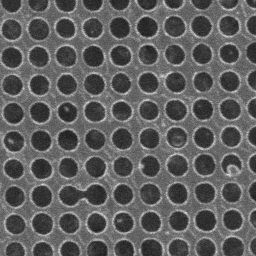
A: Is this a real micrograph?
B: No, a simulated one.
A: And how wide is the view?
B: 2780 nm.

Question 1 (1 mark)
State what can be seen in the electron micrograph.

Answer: a regular array of holes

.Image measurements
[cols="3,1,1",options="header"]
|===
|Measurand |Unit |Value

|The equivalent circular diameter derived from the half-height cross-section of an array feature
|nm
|227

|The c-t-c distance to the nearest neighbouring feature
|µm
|0.294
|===